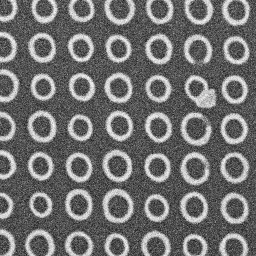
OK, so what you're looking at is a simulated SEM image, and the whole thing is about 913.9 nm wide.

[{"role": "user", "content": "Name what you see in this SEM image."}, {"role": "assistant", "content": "a regular array of ring-shaped raised bodies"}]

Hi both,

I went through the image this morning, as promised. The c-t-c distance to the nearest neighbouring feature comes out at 139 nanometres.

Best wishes